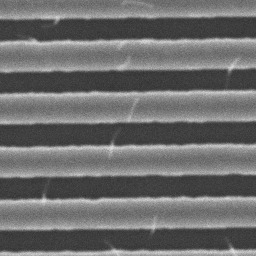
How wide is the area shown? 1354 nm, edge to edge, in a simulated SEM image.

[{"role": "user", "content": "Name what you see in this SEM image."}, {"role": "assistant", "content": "lines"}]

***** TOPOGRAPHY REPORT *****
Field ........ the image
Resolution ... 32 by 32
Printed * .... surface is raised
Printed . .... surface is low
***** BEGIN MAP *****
********************************
********************************
................................
................................
................................
********************************
********************************
********************************
*******************************.
................................
................................
...........**...*.**************
********************************
********************************
********************************
................................
................................
................................
********************************
********************************
********************************
********************************
................................
................................
................................
********************************
********************************
********************************
********************.*..........
................................
................................
*..*****************************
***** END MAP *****